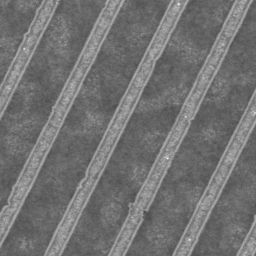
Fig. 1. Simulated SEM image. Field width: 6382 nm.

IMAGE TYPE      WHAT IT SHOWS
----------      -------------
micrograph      parallel lines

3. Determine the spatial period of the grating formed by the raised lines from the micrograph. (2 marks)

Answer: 1430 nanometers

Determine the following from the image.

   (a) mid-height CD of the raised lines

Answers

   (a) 326 nanometres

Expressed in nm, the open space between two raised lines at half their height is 1100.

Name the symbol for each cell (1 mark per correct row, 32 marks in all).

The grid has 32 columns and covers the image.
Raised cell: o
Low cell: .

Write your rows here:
.....oo......oo......oo......oo.
.....oo......oo......oo......oo.
....oo......oo......oo......oo..
....oo......oo......oo......oo..
...oo......oo......oo......oo...
...oo......oo......oo......oo...
..oo......oo......oo......oo....
..oo......oo......oo......oo....
.oo......oo......oo......oo.....
.oo......oo......oo......oo.....
oo......oo......oo......oo......
oo......oo......oo......oo......
o......oo......oo......oo......o
o......oo......oo......oo......o
......oo......oo......oo......oo
......oo......oo......oo......oo
.....oo......oo......oo......oo.
.....oo......oo......oo......oo.
....oo......oo......oo......oo..
....oo......oo......oo......oo..
...oo......oo......oo......oo...
...oo......oo......oo......oo...
..oo......oo......oo......oo....
..oo......oo......oo......oo....
.oo......oo......oo......oo.....
.oo......oo......oo......oo.....
oo......oo......oo......oo......
oo......oo......oo......oo......
o......oo......oo......oo.......
o......oo......oo......oo......o
......oo......oo......oo......oo
......oo......oo......oo......oo